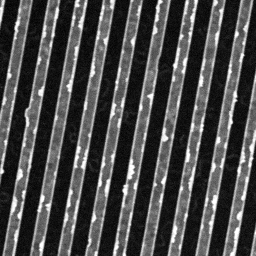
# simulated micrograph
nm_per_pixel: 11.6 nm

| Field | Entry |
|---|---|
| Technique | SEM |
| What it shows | parallel lines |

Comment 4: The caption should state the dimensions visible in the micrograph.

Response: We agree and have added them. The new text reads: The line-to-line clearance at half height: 191 nm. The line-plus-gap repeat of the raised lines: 316 nanometers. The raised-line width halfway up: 123 nanometers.